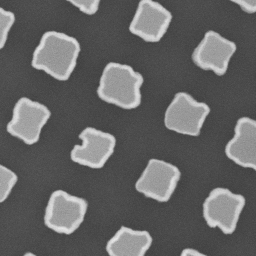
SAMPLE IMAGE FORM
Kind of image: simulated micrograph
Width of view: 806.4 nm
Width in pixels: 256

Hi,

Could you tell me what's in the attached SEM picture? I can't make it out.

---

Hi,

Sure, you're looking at a regular array of raised bodies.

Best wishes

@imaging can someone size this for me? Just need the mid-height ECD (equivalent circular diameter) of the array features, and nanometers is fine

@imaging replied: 127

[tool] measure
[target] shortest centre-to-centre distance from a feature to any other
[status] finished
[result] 222 nanometres